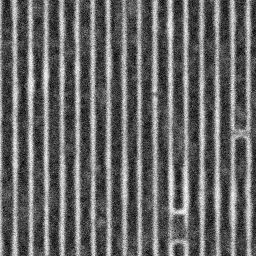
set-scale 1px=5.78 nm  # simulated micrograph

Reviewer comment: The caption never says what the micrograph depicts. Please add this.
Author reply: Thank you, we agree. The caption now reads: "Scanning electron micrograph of parallel lines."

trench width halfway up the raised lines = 73.7 nanometers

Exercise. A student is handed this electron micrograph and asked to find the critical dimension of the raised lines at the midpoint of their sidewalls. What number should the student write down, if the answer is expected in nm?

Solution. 15.2